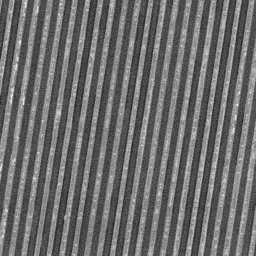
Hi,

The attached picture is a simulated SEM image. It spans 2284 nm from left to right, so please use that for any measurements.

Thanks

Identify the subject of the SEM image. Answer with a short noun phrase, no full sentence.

parallel lines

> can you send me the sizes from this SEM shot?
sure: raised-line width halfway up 46.3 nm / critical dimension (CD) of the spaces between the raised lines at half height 70.5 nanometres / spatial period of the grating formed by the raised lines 111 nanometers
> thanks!